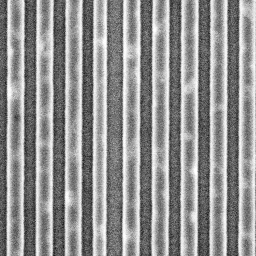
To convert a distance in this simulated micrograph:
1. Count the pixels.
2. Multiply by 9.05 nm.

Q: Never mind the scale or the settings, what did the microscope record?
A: parallel lines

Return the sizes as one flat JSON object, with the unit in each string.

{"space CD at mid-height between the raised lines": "119 nm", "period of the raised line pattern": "262 nm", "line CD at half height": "16 px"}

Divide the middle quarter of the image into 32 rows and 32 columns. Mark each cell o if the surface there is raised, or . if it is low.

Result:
oooo....oo.....oooo...oooo...ooo
oooo....oo.....oooo...oooo...ooo
oooo....oo.....oooo...oooo...ooo
oooo....oo.....oooo...oooo...ooo
oooo....oo.....oooo...oooo...ooo
oooo....oo.....oooo...oooo...ooo
oooo....oo.....oooo...oooo...ooo
oooo....oo.....oooo...oooo...ooo
oooo....oo.....oooo...oooo...ooo
oooo....oo.....oooo...oooo...ooo
oooo....ooo....oooo...oooo...ooo
oooo....oo.....oooo...oooo...ooo
oooo....oo.....oooo...oooo...ooo
oooo....oo.....oooo...oooo...ooo
oooo....oo.....oooo...oooo...ooo
oooo....ooo....oooo...oooo...ooo
oooo....oo.....oooo...oooo...ooo
oooo...ooo.....oooo...oooo...ooo
oooo...ooo.....oooo...oooo...ooo
oooo...ooo.....oooo...oooo...ooo
oooo...ooo.....oooo...oooo...ooo
oooo...ooo.....oooo...oooo...ooo
oooo...ooo.....oooo...oooo...ooo
oooo...ooo.....oooo...oooo...ooo
.ooo...ooo.....oooo...oooo...ooo
oooo...ooo.....oooo...oooo...ooo
oooo...ooo.....oooo...oooo...ooo
oooo...ooo.....oooo...oooo....oo
oooo...ooo.....oooo...oooo...ooo
oooo...ooo.....oooo...oooo...ooo
oooo...ooo.....oooo...oooo...ooo
oooo...ooo.....oooo...oooo...ooo